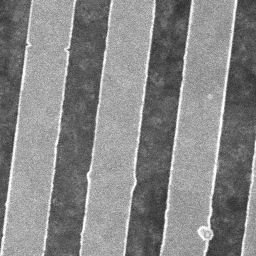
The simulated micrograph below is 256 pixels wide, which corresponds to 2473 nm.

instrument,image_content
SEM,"one or a few lines or trenches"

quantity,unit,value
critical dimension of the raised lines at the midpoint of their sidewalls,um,0.421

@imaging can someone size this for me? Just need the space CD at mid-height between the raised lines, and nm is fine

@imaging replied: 346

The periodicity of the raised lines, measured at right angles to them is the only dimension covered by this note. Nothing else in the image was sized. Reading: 770 nm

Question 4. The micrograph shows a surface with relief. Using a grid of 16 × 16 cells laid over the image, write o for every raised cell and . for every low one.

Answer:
..ooo..ooo..ooo.
..ooo..ooo..ooo.
..oo...oo...oo..
..oo...oo...oo..
.ooo..ooo..ooo..
.ooo..ooo..ooo..
.ooo..ooo..ooo..
.ooo..ooo..ooo..
.ooo..ooo..ooo..
.oo...ooo..ooo..
.oo...oo...oo...
.oo...oo...oo...
ooo..ooo..ooo...
ooo..ooo..ooo..o
ooo..ooo..ooo..o
ooo..ooo..ooo..o